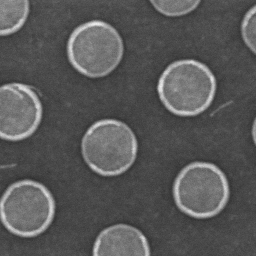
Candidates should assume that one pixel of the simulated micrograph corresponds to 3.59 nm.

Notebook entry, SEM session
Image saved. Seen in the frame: raised bodies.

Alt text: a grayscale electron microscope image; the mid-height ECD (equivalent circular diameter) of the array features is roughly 196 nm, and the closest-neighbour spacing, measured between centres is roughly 0.354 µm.